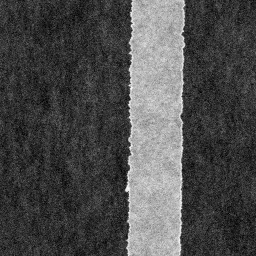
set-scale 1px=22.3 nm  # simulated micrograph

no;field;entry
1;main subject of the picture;one or a few lines or trenches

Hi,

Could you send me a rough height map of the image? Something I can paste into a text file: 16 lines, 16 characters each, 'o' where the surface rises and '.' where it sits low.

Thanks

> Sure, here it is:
........ooo.....
........ooo.....
........ooo.....
........ooo.....
........ooo.....
........ooo.....
........ooo.....
........ooo.....
........ooo.....
........ooo.....
........ooo.....
........ooo.....
........ooo.....
........ooo.....
........ooo.....
........ooo.....